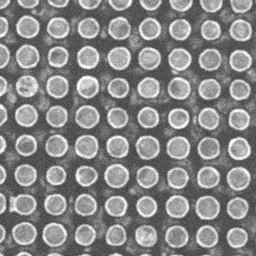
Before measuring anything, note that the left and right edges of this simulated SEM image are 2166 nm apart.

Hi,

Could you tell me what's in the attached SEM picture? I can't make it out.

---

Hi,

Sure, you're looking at a regular array of raised bodies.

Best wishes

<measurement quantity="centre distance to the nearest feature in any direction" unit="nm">247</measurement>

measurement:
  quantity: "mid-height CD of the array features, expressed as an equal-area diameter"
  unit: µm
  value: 0.171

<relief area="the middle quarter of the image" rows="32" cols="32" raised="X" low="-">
-----XXX----XXX----XXXX----XXXX-
--------------------------------
--------------------------------
-----XX-------------------------
X---XXXX----XXX----XXXX----XXXX-
X---XXXX---XXXXX---XXXXX--XXXXX-
X---XXXX---XXXXX---XXXXX--XXXXX-
----XXXX----XXXX---XXXX---XXXXX-
----------------------------XX--
--------------------------------
--------------------------------
----XXXX----XX------XX----------
---XXXXX---XXXXX---XXXX----XXXX-
---XXXXX---XXXXX---XXXX---XXXXX-
---XXXXX---XXXX----XXXX----XXXX-
-----XX------XX-----XX------XX--
--------------------------------
--------------------------------
----XXXX----XXX-----XX------XX--
X--XXXXX---XXXXX---XXXX---XXXXX-
X--XXXXX---XXXXX--XXXXXX--XXXXX-
---XXXXX---XXXXX---XXXXX--XXXXX-
----XXXX----XXX----XXXX---XXXXX-
--------------------XX----------
--------------------------------
------------XX------------------
----XXXX---XXXXX---XXX-----XXX--
---XXXXX--XXXXXX--XXXXX---XXXXX-
---XXXXX--XXXXXX--XXXXX---XXXXX-
----XXX----XXXX----XXXX---XXXXX-
------------XX------XX-----XXX--
--------------------------------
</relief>